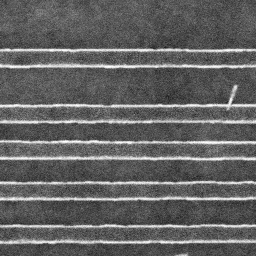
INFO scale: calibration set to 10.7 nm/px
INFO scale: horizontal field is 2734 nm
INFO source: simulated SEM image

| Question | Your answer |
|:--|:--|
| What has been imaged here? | lines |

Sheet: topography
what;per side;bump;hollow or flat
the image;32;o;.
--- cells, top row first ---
................................
................................
................................
................................
................................
................................
oooooooooooooooooooooooooooooooo
oooooooooooooooooooooooooooooooo
................................
................................
................................
................................
................................
oooooooooooooooooooooooooooooooo
oooooooooooooooooooooooooooooooo
................................
................................
................................
oooooooooooooooooooooooooooooooo
oooooooooooooooooooooooooooooooo
................................
................................
................................
oooooooooooooooooooooooooooooooo
oooooooooooooooooooooooooooooooo
................................
................................
................................
oooooooooooooooooooooooooooooooo
oooooooooooooooooooooooooooooooo
................................
................................